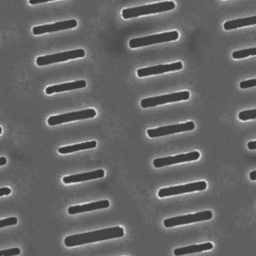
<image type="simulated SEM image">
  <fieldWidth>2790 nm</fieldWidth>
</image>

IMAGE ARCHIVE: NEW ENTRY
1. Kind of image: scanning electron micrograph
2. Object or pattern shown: a regular array of holes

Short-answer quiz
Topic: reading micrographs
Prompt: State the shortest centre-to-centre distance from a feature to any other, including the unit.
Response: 330 nm